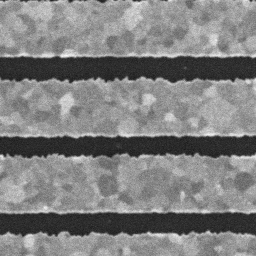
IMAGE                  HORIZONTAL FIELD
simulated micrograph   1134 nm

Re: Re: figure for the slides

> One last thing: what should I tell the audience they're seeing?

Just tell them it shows lines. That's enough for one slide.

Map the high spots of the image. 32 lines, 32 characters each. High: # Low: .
################################
################################
################################
################################
################################
################################
################################
................................
................................
................................
################################
################################
################################
################################
################################
################################
################################
................................
................................
#.....##......##..#######.......
################################
################################
################################
################################
################################
################################
######.#####...####.#.#.####..##
................................
................................
######.##..#####################
################################
################################